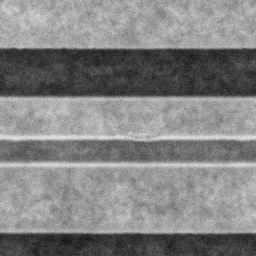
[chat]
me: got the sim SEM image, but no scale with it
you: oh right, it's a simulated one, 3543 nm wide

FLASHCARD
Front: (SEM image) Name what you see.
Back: lines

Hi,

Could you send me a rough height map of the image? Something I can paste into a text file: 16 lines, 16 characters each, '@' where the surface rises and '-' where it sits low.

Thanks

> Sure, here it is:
@@@@@@@@@@@@@@@@
@@@@@@@@@@@@@@@@
@@@@@@@@@@@@@@@@
----------------
----------------
----------------
@@@@@@@@@@@@@@@@
@@@@@@@@@@@@@@@@
@@@@@@@@@@@@@@@@
@@@@@@@@@@@@@@@@
@@@@@@@@@@@@@@@@
@@@@@@@@@@@@@@@@
@@@@@@@@@@@@@@@@
@@@@@@@@@@@@@@@@
-----@@@@@@@@@@@
----------------